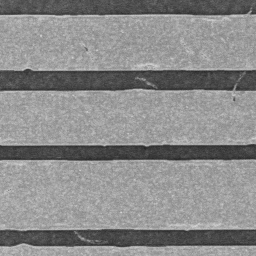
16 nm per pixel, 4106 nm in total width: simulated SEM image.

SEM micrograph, one or a few lines or trenches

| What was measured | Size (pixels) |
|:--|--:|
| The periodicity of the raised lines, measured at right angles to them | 76.1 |